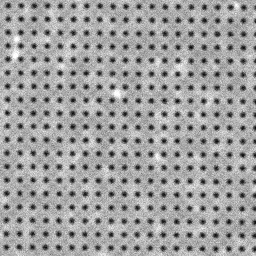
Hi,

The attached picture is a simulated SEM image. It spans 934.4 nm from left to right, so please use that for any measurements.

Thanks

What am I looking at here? a regular array of holes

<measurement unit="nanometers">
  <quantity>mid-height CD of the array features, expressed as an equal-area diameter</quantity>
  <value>21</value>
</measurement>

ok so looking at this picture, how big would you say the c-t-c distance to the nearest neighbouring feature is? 46.6 nanometres